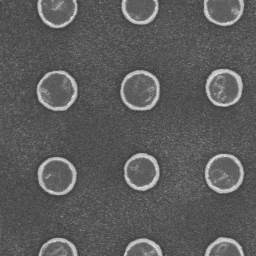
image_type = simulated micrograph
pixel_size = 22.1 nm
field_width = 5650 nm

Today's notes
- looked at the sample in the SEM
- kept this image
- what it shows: raised bodies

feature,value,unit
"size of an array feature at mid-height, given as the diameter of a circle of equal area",794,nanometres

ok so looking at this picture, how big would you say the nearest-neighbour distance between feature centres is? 82.9 pixels